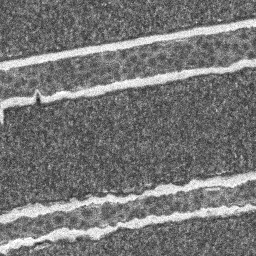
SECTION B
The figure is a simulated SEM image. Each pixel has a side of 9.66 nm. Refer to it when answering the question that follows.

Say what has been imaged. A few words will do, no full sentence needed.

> one or a few lines or trenches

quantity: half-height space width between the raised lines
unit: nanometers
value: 1070